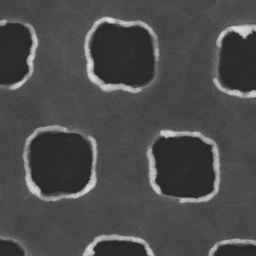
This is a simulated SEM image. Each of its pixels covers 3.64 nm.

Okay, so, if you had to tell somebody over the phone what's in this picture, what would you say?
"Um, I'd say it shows holes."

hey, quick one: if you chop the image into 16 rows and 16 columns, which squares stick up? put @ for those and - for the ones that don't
@@@@@@@@@@@@@@@@
-@@@@@-@@@@@@@@@
--@@@@---@@@@@--
--@@@@----@@@@--
--@@@@----@@@@--
@@@@@@@@@@@@@@--
@@@@@@@@@@@@@@@@
@@@@@@@@@@@@@@@@
@@---@@@@@@@@@@@
@@----@@@@---@@@
@@----@@@@---@@@
@@---@@@@@---@@@
@@@@@@@@@@@@@@@@
@@@@@@@@@@@@@@@@
@@@@@@@@@@@@@@@@
-@@@@@---@@@@@--